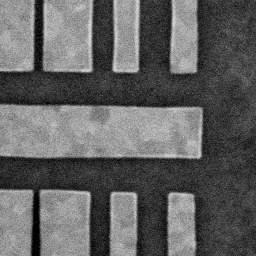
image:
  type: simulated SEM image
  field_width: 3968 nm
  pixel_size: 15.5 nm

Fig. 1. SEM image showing groups of lines, slits or small figures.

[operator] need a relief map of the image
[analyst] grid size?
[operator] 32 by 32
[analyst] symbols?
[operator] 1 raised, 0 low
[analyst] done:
11110011111000111000001110000000
11110011111000111000001110000000
11110011111000111000001110000000
11110011111000111000001110000000
11110011111000111000001110000000
11110011111000111000001110000000
11110011111000111000011110000000
11110111111000111000011110000000
11110011111000111000011110000000
00000000000000000000000000000000
00000000000000000000000000000000
00000000000000000000000000000000
00000000000000000000000000000000
11111111111111111110000010000000
11111111111111111111111110000000
11111111111111111111111110000000
11111111111111111111111110000000
11111111111111111111111110000000
11111111111111111111111110000000
00111111111111111111111110000000
00000000000000000000000000000000
00000000000000000000000000000000
00000000000000000000000000000000
00000000000000000000000000000000
11110111111000111000011100000000
11110111111000111000011100000000
11110111111000111000011100000000
11110111111000111000011100000000
11110111111000111000011100000000
11110111111000111000011100000000
11110111111000111000011100000000
11110111111000111000011100000000